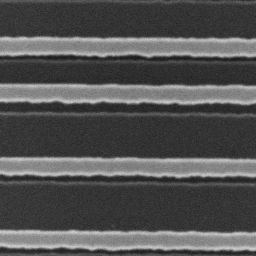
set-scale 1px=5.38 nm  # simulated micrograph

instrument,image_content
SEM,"lines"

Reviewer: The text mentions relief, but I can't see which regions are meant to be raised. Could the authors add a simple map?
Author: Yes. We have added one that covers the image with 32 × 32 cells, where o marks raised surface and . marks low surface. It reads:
................................
................................
................................
................................
................................
oooooooooooooooooooooooooooooooo
oooooooooooooooooooooooooooooooo
................................
................................
................................
................................
oooooooooooooooooooooooooooooooo
oooooooooooooooooooooooooooooooo
................................
................................
................................
................................
................................
................................
................................
oooooooooooooooooooooooooooooooo
oooooooooooooooooooooooooooooooo
................................
................................
................................
................................
................................
................................
................................
oooooooooooooooooooooooooooooooo
oooooooooooooooooooooooooooooooo
................................